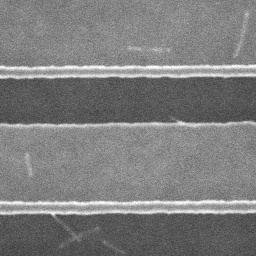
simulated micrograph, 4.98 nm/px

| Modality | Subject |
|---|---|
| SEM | lines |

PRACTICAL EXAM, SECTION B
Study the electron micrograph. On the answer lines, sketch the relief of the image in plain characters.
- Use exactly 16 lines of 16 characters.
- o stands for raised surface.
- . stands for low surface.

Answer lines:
oooooooooooooooo
oooooooooooooooo
oooooooooooooooo
oooooooooooooooo
oooooooooooooooo
................
................
................
oooooooooooooooo
oooooooooooooooo
oooooooooooooooo
oooooooooooooooo
oooooooooooooooo
................
................
................